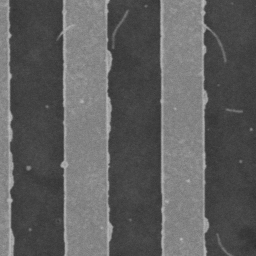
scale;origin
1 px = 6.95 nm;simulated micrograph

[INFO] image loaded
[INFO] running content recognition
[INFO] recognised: lines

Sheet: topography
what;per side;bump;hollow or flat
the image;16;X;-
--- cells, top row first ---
X---XXX---XXX---
X---XXX---XXX---
X---XXX---XXX---
X---XXX---XXX---
X---XXX---XXX---
X---XXX---XXX---
X---XXX---XXX---
X---XXX---XXX---
X---XXX---XXX---
X---XXX---XXX---
X---XXX---XXX---
X---XXX---XXX---
X---XXX---XXX---
X---XXX---XXX---
X---XXX---XXX---
X---XXX---XXX---